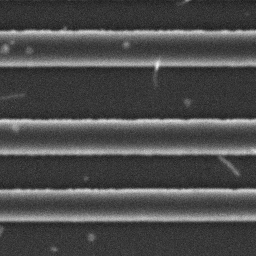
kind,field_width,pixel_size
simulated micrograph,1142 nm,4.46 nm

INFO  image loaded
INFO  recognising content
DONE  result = lines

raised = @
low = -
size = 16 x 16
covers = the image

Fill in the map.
----------------
----------------
@@@@@@@@@@@@@@@@
@@@@@@@@@@@@@@@@
----------------
----------------
----------------
----------------
@@@@@@@@@@@@@@@@
@@@@@@@@@@@@@@@@
----------------
----------------
@@@@@@@@@@@@@@@@
@@@@@@@@@@@@@@@@
----------------
----------------